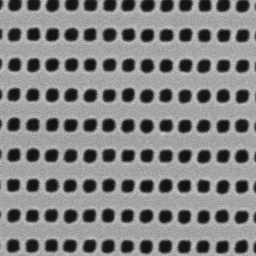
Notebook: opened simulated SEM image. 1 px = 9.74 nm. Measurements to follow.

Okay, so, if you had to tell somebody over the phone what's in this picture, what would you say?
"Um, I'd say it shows a regular array of holes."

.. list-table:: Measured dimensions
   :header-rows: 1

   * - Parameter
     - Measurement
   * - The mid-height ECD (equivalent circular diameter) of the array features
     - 146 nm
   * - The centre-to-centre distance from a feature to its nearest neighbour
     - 0.183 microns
